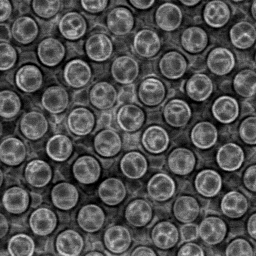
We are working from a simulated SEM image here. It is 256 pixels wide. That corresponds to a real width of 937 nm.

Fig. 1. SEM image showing a regular array of raised bodies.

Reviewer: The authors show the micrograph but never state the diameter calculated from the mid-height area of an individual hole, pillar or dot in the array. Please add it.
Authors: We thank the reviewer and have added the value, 0.0953 µm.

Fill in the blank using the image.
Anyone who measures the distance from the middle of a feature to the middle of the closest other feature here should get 0.123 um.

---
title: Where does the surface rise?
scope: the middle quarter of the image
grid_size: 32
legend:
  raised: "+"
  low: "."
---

.+++++......++++++......++++++..
++++++......++++++......++++++..
++++++......++++++.......+++++..
++++++.......+++++........++....
.+++++........++....++++.......+
..++....++++.......++++++......+
.......++++++......++++++......+
+......++++++......++++++......+
+......++++++......++++++.......
+......++++++.......++++..++++..
+.......++++...+++........+++++.
...+++........+++++......++++++.
..+++++.......++++++.....+++++++
.++++++......+++++++.....++++++.
.++++++.......++++++......+++++.
.++++++.......+++++.........+...
..+++++........+++...++++.......
....++...++++.......++++++......
+.......++++++......++++++......
++......++++++......++++++......
++......++++++......++++++......
++......++++++.......++++...+++.
++.......++++...+++........+++++
+...+++........+++++......++++++
...+++++......++++++......++++++
...++++++.....+++++++.....++++++
...++++++......+++++.......+++++
...++++++......+++++............
...+++++.........+....++++......
....+++...++++.......++++++.....
++.......++++++......++++++.....
+++......++++++......++++++.....